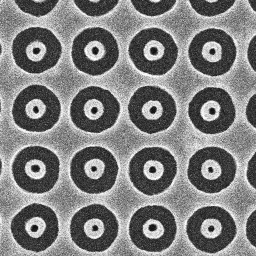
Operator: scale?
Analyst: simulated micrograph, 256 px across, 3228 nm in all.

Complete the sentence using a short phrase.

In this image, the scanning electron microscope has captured a regular array of ring-shaped grooves with a dot in the middle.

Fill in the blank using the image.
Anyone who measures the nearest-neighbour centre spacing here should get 734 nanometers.